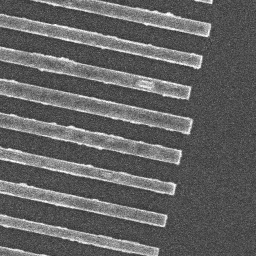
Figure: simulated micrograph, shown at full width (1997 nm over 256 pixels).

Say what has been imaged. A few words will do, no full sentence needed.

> parallel lines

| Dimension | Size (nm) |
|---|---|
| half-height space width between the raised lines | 149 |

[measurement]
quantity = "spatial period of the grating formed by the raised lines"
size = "32.6 pixels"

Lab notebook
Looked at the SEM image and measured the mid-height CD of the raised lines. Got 0.102 microns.